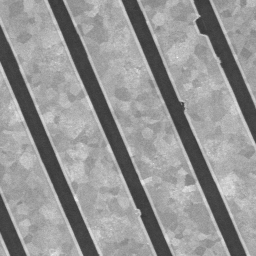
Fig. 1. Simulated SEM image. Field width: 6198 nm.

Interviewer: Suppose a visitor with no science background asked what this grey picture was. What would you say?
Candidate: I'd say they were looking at one or a few lines or trenches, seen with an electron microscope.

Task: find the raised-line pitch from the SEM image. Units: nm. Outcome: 1630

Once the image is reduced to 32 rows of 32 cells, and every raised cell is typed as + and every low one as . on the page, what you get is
++++++..+++++++...++++++...+++++
++++++...+++++++..++++++...+++++
+++++++..+++++++..++++++...+++++
+++++++...++++++...++++++...++++
.+++++++..+++++++..+++++++..++++
.+++++++..+++++++...++++++...+++
..++++++...+++++++..+++++++..+++
..+++++++..+++++++..+++++++...++
...++++++...+++++++..+++++++..++
+..+++++++..+++++++..+++++++...+
+..+++++++...++++++...++++++...+
+...+++++++..+++++++..+++++++..+
++..+++++++..+++++++...++++++...
++...+++++++..+++++++..+++++++..
+++..+++++++..+++++++..+++++++..
+++...++++++...+++++++..+++++++.
++++..+++++++..+++++++..+++++++.
++++..+++++++...++++++...+++++++
++++...+++++++..+++++++..+++++++
+++++..+++++++..+++++++...++++++
+++++...+++++++..+++++++..++++++
++++++..+++++++..+++++++..++++++
++++++..+++++++...+++++++..+++++
+++++++..+++++++..+++++++..+++++
+++++++..+++++++...++++++...++++
.++++++...+++++++..+++++++..++++
.+++++++..+++++++..+++++++...+++
..++++++...+++++++..+++++++..+++
..+++++++..+++++++..+++++++...++
..+++++++...++++++...+++++++..++
...+++++++..+++++++..+++++++..++
+..+++++++..+++++++...++++++...+